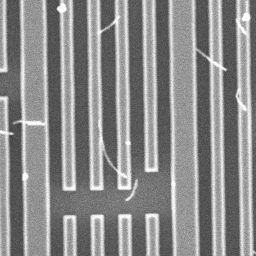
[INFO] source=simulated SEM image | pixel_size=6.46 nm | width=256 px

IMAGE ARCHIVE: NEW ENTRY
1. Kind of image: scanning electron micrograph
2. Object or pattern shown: groups of lines, slits or small figures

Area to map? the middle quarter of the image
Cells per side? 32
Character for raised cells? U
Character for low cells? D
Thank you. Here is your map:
UUDDDDUUUDDDDUUUDDDDUUUDDDDUUUUU
UUDDDDUUUDDDDUUUDDDDUUUDDDDUUUUU
UUDDDDUUUDDDDUUUDDDDUUUDDDDUUUUU
UUDDDDUUUDDDDUUUDDDDUUUDDDDUUUUU
UUDDDDUUUDDDDUUUDDDDUUUDDDDUUUUU
UUDDDDUUUDDDDUUUDDDDUUUDDDDUUUUU
UUDDDDUUUDDDDUUUDDDDUUUDDDDUUUUU
UUDDDDUUUDDDDUUUDDDDUUUDDDDUUUUU
UUDDDDUUUDDDDUUUDDDDUUUDDDDUUUUU
UUDDDDUUUDDDDUUUDDDDUUUDDDDUUUUU
UUDDDDUUUDDDDUUUDDDDUUUDDDDUUUUU
UUDDDDDUUDDDDDUUDDDDUUUDDDDUUUUU
UUDDDDDUUDDDDDUUDDDDUUUDDDDUUUUU
UUDDDDDUUDDDDDUUDDDDUUUDDDDUUUUU
UUDDDDDUUDDDDDUUDDDDUUUDDDDUUUUU
UUDDDDDUUDDDDDUUDDDDUUUDDDDUUUUU
UUDDDDDUUDDDDDUUDDDDUUUDDDDUUUUU
UUDDDDDUUDDDDDUUDDDDUUUDDDDUUUUU
UUDDDDDUUDDDDDUUDDDDUUUDDDDUUUUU
UUDDDDDUUUDDDDUUDDDDDUUDDDDUUUUU
UUDDDDDUUDDDDDUUDDDDDUUDDDDUUUUU
UUDDDDDUUDDDDDUUDDDDDUUDDDDUUUUU
UUDDDDDUUDDDDDUUDDDDDUUDDDDUUUUU
UUDDDDDUUDDDDDUUDDDDDUUDDDDUUUUU
UUUDDDDUUDDDDDUUDDDDDUUDDDDUUUUU
UUUDDDDUUDDDDDUUDDDDDUUDDDDUUUUU
UUUDDDDUUDDDDUUUDDDDDUUDDDDUUUUU
UUUDDDDUUDDDDDUUDDDDDDDDDDDUUUUU
UUUDDDDUUDDDDDUUDDDDDDDDDDDUUUUU
UUUDDDDUUDDDDDUUDDDDDDDDDDDUUUUU
UUUDDDDUUDDDDDUUDDDDDDDDDDDUUUUU
DDDDDDDDDDDDDDDDDDDDDDDDDDDUUUUU